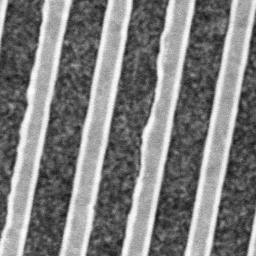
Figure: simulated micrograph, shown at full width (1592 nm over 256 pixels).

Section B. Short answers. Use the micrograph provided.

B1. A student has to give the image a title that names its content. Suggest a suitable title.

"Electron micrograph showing one or a few lines or trenches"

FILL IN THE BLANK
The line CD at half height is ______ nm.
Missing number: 124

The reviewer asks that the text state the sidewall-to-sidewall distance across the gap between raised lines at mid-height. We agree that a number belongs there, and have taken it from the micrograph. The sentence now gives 258 nanometers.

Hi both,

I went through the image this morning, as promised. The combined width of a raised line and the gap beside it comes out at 381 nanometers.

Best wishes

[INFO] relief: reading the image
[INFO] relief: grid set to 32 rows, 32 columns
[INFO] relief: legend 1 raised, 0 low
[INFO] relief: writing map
10000011000000110000011100000111
00000011000001110000011100000111
00000111000001110000011100000110
00000111000001110000011100000110
00000111000001110000111000000110
00000110000001100000111000001110
00000110000001100000111000001110
00000110000011100000111000001100
00001110000011100000111000001100
00001110000011100000110000001100
00001110000011000000110000011100
00001100000011000000110000011100
00001100000111000001110000011100
00001100000111000001110000011000
00011100000111000001100000011000
00011100000110000001100000111000
00011000000110000011100000111000
00011000001110000011100000111000
00011000001110000011100000110000
00111000001110000011100000110000
00111000001110000011000000110000
00111000001100000011000001110000
00110000001100000111000001110000
00110000011100000111000001110000
01110000011100000111000001100000
01110000011100000110000001100000
01110000011000000110000011100000
01100000011000001110000011100000
01100000111000001110000011100000
11100000111000001110000011000000
11100000111000001100000011000001
11100000110000011100000111000001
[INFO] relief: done